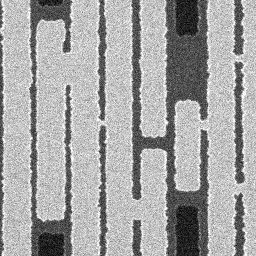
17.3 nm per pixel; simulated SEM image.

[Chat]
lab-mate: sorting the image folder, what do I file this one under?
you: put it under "parallel lines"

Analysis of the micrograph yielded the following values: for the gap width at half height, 8.87 pixels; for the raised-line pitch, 591 nm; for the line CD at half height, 0.449 um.